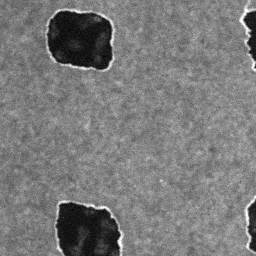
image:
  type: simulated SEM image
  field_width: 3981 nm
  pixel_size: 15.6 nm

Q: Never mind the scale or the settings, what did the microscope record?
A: holes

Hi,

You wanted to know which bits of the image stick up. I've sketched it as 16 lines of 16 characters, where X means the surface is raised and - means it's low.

XXXXXXXXXXXXXXX-
XXX----XXXXXXXX-
XXX----XXXXXXXX-
XXX----XXXXXXXXX
XXXXXXXXXXXXXXXX
XXXXXXXXXXXXXXXX
XXXXXXXXXXXXXXXX
XXXXXXXXXXXXXXXX
XXXXXXXXXXXXXXXX
XXXXXXXXXXXXXXXX
XXXXXXXXXXXXXXXX
XXXXXXXXXXXXXXXX
XXXXXXXXXXXXXXXX
XXXX---XXXXXXXX-
XXXX----XXXXXXX-
XXXX---XXXXXXXXX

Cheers